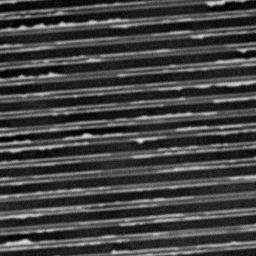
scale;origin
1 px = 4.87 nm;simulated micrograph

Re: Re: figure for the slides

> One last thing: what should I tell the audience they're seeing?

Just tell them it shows parallel lines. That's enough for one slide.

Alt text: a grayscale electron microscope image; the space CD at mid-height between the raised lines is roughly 49.7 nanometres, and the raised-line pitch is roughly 80.3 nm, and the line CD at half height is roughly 0.0327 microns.